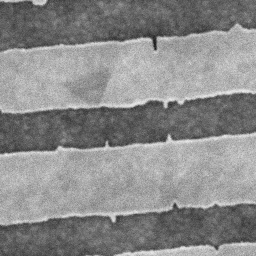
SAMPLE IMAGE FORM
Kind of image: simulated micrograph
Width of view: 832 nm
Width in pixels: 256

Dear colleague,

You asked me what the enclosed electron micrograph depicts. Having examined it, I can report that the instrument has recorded one or a few lines or trenches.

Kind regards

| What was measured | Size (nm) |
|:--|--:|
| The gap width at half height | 130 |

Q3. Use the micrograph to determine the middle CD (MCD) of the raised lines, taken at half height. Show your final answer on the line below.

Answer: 214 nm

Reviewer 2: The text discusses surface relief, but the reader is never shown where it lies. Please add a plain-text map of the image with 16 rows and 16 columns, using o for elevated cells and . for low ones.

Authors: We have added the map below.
................
................
........o.oooooo
oooooooooooooooo
oooooooooooooooo
oooooooooooooooo
ooooooooo.......
................
..............oo
..oooooooooooooo
oooooooooooooooo
oooooooooooooooo
oooooooooooooooo
oooo............
................
...........ooooo